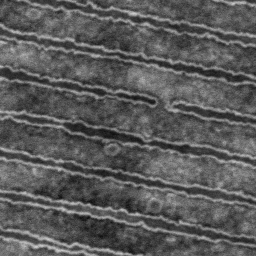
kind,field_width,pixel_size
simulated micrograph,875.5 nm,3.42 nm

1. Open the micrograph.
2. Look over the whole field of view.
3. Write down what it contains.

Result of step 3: parallel lines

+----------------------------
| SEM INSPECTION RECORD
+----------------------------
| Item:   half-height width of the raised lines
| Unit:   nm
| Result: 30.7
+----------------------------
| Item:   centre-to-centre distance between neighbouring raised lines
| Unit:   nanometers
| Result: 135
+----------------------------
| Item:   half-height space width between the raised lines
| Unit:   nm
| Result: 102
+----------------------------